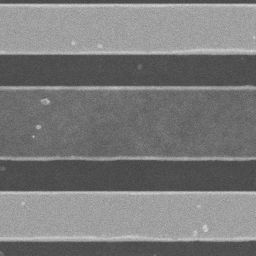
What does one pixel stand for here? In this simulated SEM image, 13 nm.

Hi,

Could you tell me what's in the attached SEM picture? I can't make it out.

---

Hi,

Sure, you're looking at lines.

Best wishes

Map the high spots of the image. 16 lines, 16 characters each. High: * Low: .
****************
****************
****************
................
................
****************
****************
****************
****************
****************
................
................
****************
****************
****************
................